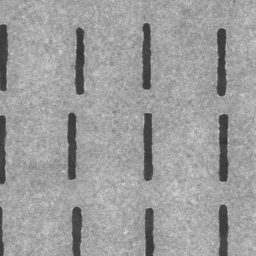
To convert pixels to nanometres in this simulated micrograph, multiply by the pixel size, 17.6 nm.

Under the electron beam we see holes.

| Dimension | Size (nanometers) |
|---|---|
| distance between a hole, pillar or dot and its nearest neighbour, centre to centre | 1330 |